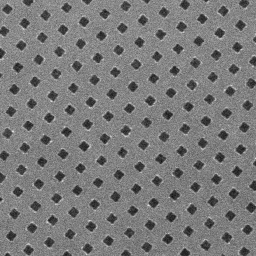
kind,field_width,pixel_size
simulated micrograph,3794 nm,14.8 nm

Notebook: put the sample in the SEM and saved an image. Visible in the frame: a regular array of raised bodies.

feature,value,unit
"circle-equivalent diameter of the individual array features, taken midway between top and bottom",0.159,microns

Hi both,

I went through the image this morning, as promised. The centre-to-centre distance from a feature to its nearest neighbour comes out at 0.329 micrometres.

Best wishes